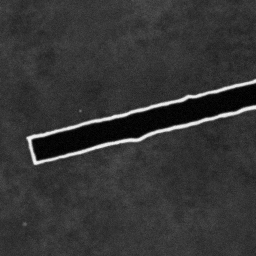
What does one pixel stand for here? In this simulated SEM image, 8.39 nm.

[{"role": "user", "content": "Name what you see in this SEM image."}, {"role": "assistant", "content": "one or a few lines or trenches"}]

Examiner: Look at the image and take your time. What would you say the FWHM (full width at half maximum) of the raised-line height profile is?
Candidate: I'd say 219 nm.